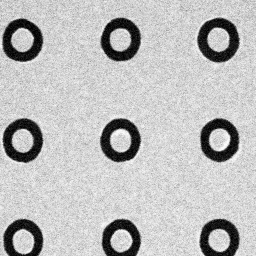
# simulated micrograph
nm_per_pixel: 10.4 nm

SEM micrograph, ring-shaped grooves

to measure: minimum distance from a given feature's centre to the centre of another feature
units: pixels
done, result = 97.7